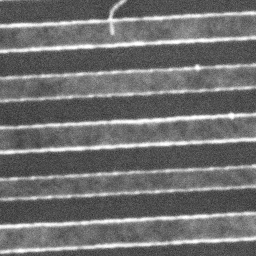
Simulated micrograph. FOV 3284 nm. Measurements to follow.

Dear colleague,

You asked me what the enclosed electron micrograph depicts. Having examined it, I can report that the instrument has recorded lines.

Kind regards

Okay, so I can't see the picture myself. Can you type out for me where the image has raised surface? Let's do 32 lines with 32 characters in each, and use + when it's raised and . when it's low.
................................
................................
.............+++++++++++++++++++
++++++++++++++++++++++++++++++++
++++++++++++++++++++++++++++++++
++++++++++++++++++..............
................................
................................
........................++++++++
.....+++++++++++++++++++++++++++
++++++++++++++++++++++++++++++++
+++++++++++++++++++++...........
+++.............................
................................
...........................+++++
........++++++++++++++++++++++++
++++++++++++++++++++++++++++++++
++++++++++++++++++++++++++++++++
++++++++++++....................
................................
................................
...................+++++++++++++
++++++++++++++++++++++++++++++++
+++++++++++++++++++++++++++++...
+++++++++.......................
................................
................................
................++++++++++++++++
++++++++++++++++++++++++++++++++
++++++++++++++++++++++++++++++++
+++++++++++++++++++++...........
+...............................